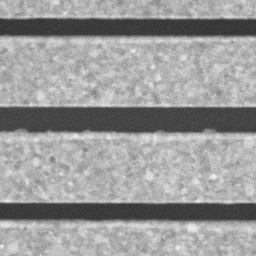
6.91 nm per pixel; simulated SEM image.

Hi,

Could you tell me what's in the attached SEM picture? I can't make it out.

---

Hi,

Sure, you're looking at lines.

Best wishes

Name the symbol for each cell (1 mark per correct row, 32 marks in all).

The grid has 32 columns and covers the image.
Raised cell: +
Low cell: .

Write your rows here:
++++++++++++++++++++++++++++++++
++++++++++++++++++++++++++++++++
................................
................................
................................
++++++++++++++++++++++++++++++++
++++++++++++++++++++++++++++++++
++++++++++++++++++++++++++++++++
++++++++++++++++++++++++++++++++
++++++++++++++++++++++++++++++++
++++++++++++++++++++++++++++++++
++++++++++++++++++++++++++++++++
++++++++++++++++++++++++++++++++
................................
................................
................................
................................
++++++++++++++++++++++++++++++++
++++++++++++++++++++++++++++++++
++++++++++++++++++++++++++++++++
++++++++++++++++++++++++++++++++
++++++++++++++++++++++++++++++++
++++++++++++++++++++++++++++++++
++++++++++++++++++++++++++++++++
++++++++++++++++++++++++++++++++
................................
................................
................................
++++++++++++++++++++++++++++++++
++++++++++++++++++++++++++++++++
++++++++++++++++++++++++++++++++
++++++++++++++++++++++++++++++++